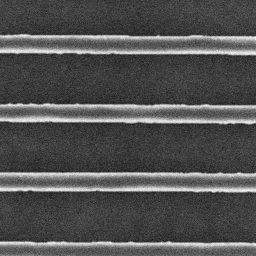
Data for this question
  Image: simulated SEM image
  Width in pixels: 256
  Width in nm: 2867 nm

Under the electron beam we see lines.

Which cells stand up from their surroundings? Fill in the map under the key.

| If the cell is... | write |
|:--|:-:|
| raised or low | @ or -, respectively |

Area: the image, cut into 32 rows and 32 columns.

--------------------------------
--------------------------------
--------------------------------
--------------------------------
@@@@@@@@@@@@@@@@-------@@-------
@@@@@@@@@@@@@@@@@@@@@@@@@@@@@@@@
-@@-@@@@@@@@@@@@@@@@@@@@@@@@@@@@
--------------------------------
--------------------------------
--------------------------------
--------------------------------
--------------------------------
--------------------------------
@@@@@@@@@@@@@@@@@@@@@@@@@@@@@@@@
@@@@@@@@@@@@@@@@@@@@@@@@@@@@@@@@
--------------------------------
--------------------------------
--------------------------------
--------------------------------
--------------------------------
--------------------------------
--------------------------------
@@@@@@@@@@@@@@@@@@@@@@@@@@@@@@@@
@@@@@@@@@@@@@@@@@@@@@@@@@@@@@@@@
--------------------------------
--------------------------------
--------------------------------
--------------------------------
--------------------------------
--------------------------------
@@@@@@@@@@@@@@@@@@@@@@@@@@@@@@@@
@@@@@@@@@@@@@@@@@@@@@@@@@@@@@@@@